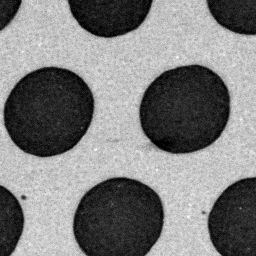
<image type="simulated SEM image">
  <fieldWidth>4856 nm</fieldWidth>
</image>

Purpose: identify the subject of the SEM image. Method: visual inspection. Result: holes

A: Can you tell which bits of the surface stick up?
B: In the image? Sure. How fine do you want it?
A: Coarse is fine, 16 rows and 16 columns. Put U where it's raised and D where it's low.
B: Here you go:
DUUUDDDDDUUUUDDD
DUUUUDDDDUUUUUDD
UUUUUUUUUUUUUUUU
UUUUUUUUUUUUUUUU
UUDDDUUUUUDDDUUU
UDDDDDUUUDDDDDUU
DDDDDDUUUDDDDDUU
DDDDDDUUUDDDDDUU
UDDDDUUUUDDDDDUU
UUDDUUUUUUDDUUUU
UUUUUUUUUUUUUUUU
UUUUUUDDDUUUUUUD
DUUUUDDDDDUUUUDD
DUUUUDDDDDUUUDDD
DUUUUDDDDDUUUDDD
DUUUUDDDDUUUUDDD